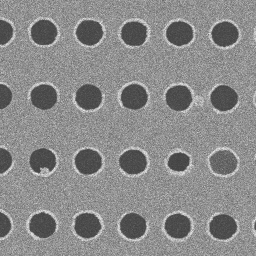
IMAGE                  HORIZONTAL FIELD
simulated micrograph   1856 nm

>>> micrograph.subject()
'a regular array of holes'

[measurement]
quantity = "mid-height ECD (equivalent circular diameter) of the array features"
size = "188 nm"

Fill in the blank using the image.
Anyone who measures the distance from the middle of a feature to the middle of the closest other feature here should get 325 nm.